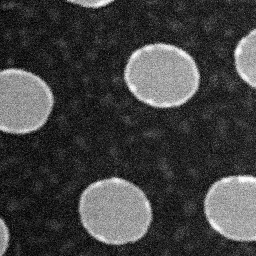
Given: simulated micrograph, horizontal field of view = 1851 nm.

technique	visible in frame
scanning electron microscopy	raised bodies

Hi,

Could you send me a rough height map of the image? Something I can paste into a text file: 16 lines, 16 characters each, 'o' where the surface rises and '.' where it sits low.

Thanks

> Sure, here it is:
................
................
...............o
........oooo...o
o.......oooo...o
ooo.....oooo....
ooo......oo.....
ooo.............
................
................
................
......oo......oo
.....oooo....ooo
.....oooo....ooo
......ooo.....oo
................